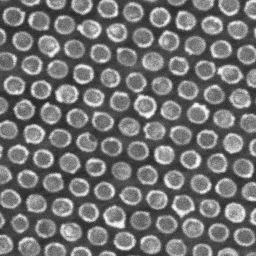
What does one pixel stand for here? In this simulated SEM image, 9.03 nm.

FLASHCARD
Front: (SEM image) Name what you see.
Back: a regular array of raised bodies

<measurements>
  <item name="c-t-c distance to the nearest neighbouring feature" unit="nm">232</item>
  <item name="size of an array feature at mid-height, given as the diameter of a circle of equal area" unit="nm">170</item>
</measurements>